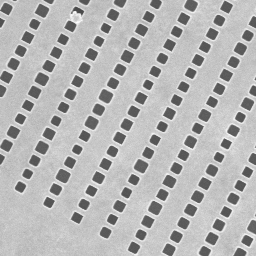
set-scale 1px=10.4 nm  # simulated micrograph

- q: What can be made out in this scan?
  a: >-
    a regular array of holes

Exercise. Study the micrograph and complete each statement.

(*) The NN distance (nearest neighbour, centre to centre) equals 155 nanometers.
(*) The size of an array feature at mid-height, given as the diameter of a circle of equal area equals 118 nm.